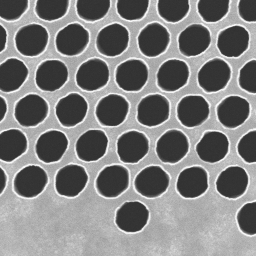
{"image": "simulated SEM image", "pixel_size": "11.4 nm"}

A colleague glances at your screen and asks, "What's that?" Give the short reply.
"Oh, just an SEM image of a regular array of holes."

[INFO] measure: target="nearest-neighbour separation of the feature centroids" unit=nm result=452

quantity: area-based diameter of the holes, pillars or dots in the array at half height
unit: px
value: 31.5